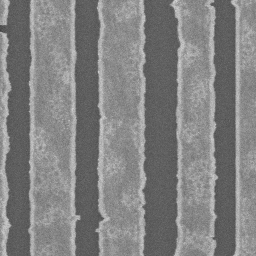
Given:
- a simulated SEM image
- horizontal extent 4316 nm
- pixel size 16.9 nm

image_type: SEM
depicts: one or a few lines or trenches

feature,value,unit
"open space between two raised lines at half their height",0.462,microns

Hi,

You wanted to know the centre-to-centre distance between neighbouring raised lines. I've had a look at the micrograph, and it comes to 1.21 um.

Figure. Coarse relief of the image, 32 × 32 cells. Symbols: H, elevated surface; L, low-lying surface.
HLLLHHHHHLLLLHHHHHLLLLHHHHLLLHHH
HLLLHHHHHLLLLHHHHHLLLLHHHHHLLLHH
LLLLHHHHHLLLLHHHHHLLLLHHHHHLLLHH
LLLLHHHHHLLLLHHHHHLLLLHHHHHLLLHH
HLLLHHHHHLLLLHHHHHLLLLLHHHLLLLHH
HLLLHHHHHLLLLHHHHHLLLLLHHHLLLLHH
HLLLHHHHHLLLLHHHHHLLLLLHHHHLLLHH
LLLLHHHHHLLLLHHHHHLLLLHHHHLLLLHH
LLLLHHHHHLLLLHHHHHLLLLLHHHHLLLHH
HLLLHHHHHLLLLHHHHHLLLLHHHHHLLLHH
HLLLHHHHHLLLLHHHHHLLLLHHHHLLLLHH
HLLLHHHHHLLLLHHHHHLLLLHHHHHLLLHH
HLLLHHHHHLLLLHHHHHLLLLLHHHHLLLHH
HLLLHHHHHLLLLHHHHHLLLLHHHHHLLLHH
HLLLHHHHHLLLLHHHHHLLLLHHHHHLLLHH
HLLLHHHHHLLLLHHHHHLLLLHHHHHLLLHH
HLLLHHHHHLLLLHHHHHLLLLHHHHHLLLHH
HLLLHHHHHLLLLHHHHHLLLLHHHHHLLLHH
HLLLHHHHHLLLLHHHHHLLLLLHHHHLLLHH
HLLLHHHHHLLLLHHHHHLLLLLHHHHLLLHH
LLLLHHHHHLLLLHHHHHLLLLHHHHHLLLHH
LLLLHHHHHLLLLHHHHHLLLLHHHHHLLLHH
HLLLHHHHHLLLLHHHHHLLLLLHHHHLLLHH
HLLLHHHHHLLLLHHHHHLLLLHHHHHLLLHH
HLLLHHHHHLLLLHHHHHLLLLLHHHHLLLHH
LLLLHHHHHLLLLHHHHHLLLLHHHHHLLLHH
LLLLHHHHHLLLLHHHHHLLLLLHHHHLLLHH
HLLLHHHHHLLLLHHHHHLLLLHHHHHLLLHH
HLLLHHHHHLLLLHHHHHLLLLLHHHHLLLHH
HLLLHHHHHLLLLHHHHHLLLLLHHHLLLLHH
LLLLHHHHHLLLLHHHHHLLLLHHHHHLLLHH
HLLLHHHHHLLLLHHHHHLLLLHHHHHLLLHH